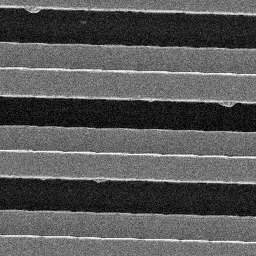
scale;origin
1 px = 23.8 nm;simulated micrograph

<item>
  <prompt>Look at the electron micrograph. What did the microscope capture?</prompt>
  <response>lines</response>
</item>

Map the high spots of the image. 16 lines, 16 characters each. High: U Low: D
DUUUUUUUUUUUUUUU
DDDDDDDDDDDDDDDD
DDDDDDDDDDDDDDDD
UUUUUUUUUUUUUUUU
UUUUUUUUUUUUUUUU
UUUUUUUUUUUUUUUU
DDDDDDDDDDDDDDUD
DDDDDDDDDDDDDDDD
UUUUUUUUUUUUUUUU
UUUUUUUUUUUUUUUU
UUUUUUUUUUUUUUUU
DDDDDDDDDDDDDDDD
DDDDDDDDDDDDDDDD
UUUUUUUUUUUUDDDD
UUUUUUUUUUUUUUUU
UUUUUUUUUUUUUUUU